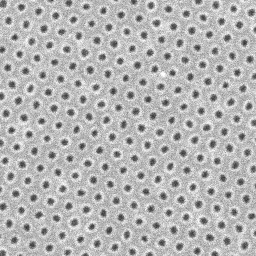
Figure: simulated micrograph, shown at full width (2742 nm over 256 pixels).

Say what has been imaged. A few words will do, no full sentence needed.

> a regular array of holes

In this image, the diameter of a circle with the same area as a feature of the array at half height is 90.5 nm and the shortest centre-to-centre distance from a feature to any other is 185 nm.